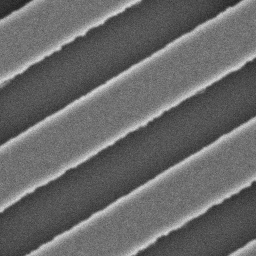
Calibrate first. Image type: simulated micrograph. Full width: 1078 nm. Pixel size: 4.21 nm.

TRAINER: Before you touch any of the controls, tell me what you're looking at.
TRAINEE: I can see lines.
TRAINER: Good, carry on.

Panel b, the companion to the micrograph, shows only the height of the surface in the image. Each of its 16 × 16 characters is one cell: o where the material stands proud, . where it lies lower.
.ooooooo......oo
oooooo.......ooo
oooo.......ooooo
ooo......ooooooo
o.......oooooo..
......ooooooo...
....ooooooo.....
...ooooooo......
.ooooooo......oo
oooooo......oooo
oooo.......ooooo
ooo......ooooooo
o......ooooooo..
......oooooo....
....ooooooo.....
..ooooooo......o